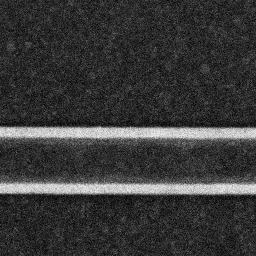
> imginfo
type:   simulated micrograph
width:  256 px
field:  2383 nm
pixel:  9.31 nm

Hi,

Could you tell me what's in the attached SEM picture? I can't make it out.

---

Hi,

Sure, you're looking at one or a few lines or trenches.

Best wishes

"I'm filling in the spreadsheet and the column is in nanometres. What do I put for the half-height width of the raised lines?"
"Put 516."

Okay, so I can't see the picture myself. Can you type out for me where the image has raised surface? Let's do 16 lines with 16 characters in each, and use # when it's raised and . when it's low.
................
................
................
................
................
................
................
................
################
################
################
################
................
................
................
................